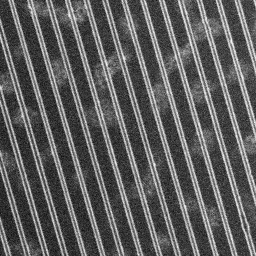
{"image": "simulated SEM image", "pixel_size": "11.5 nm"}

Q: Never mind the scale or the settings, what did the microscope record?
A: parallel lines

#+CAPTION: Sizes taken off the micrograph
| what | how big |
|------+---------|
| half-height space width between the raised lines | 159 nm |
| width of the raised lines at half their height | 48.4 nm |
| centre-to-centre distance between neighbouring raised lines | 208 nanometers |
